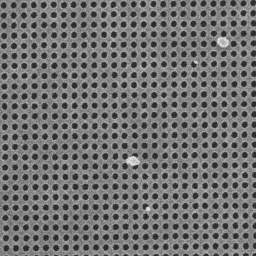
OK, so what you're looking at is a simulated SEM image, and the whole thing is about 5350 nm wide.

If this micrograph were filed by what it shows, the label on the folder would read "a regular array of holes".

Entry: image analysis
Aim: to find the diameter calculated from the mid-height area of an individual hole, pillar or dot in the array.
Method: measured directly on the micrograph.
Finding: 138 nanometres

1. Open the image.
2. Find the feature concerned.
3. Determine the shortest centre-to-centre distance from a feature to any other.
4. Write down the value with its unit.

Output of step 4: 0.202 microns